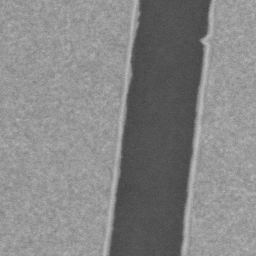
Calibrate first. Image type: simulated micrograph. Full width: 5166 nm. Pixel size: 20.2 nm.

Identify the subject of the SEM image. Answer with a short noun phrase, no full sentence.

one or a few lines or trenches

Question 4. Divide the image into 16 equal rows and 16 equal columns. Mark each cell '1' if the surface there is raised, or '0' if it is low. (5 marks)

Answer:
1111111100000111
1111111100000111
1111111100000111
1111111100000111
1111111100000111
1111111100000111
1111111100000111
1111111100001111
1111111000001111
1111111000001111
1111111000001111
1111111000001111
1111111000001111
1111111000001111
1111111000001111
1111111000001111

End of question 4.